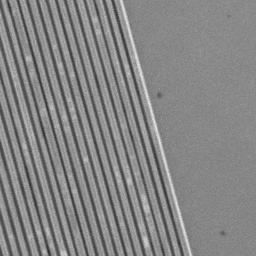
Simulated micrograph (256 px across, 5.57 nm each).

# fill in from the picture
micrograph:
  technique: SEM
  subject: parallel lines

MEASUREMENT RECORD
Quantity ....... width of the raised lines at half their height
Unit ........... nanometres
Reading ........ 30.9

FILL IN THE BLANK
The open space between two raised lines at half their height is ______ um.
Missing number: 0.0208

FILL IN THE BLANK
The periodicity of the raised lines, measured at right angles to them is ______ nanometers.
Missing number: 51.2